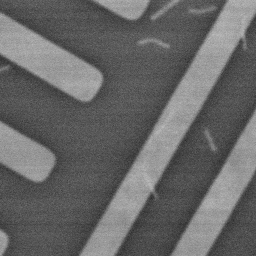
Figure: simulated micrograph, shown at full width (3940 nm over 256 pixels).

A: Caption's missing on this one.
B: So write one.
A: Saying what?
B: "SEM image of groups of lines, slits or small figures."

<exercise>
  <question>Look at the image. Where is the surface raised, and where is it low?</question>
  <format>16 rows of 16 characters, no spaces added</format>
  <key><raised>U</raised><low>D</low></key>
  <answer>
DDDDDDDUUDDDDDUU
UDDDDDDDDDDDDUUU
UUUDDDDDDDDDDUUD
UUUUUDDDDDDDUUDD
DDUUUUDDDDDDUUDD
DDDDUUDDDDDUUDDD
DDDDDDDDDDUUUDDD
DDDDDDDDDDUUDDDD
UUDDDDDDDUUUDDDU
UUUDDDDDDUUDDDUU
DUUDDDDDUUDDDDUU
DDDDDDDDUUDDDUUD
DDDDDDDUUDDDDUUD
DDDDDDUUUDDDUUDD
DDDDDDUUDDDDUUDD
DDDDDUUDDDDUUDDD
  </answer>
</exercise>